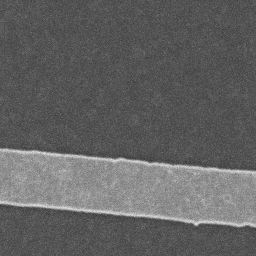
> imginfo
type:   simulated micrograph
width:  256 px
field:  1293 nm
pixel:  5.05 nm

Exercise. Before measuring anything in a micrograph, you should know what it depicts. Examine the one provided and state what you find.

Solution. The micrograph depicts one or a few lines or trenches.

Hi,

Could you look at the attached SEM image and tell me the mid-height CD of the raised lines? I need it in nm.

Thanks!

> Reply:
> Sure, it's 269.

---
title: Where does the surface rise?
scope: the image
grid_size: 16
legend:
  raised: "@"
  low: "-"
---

----------------
----------------
----------------
----------------
----------------
----------------
----------------
----------------
----------------
@@--------------
@@@@@@@@@@@@@---
@@@@@@@@@@@@@@@@
@@@@@@@@@@@@@@@@
---------@@@@@@@
----------------
----------------